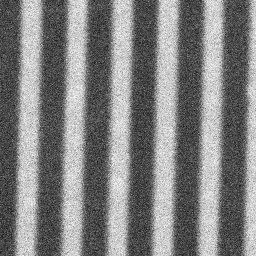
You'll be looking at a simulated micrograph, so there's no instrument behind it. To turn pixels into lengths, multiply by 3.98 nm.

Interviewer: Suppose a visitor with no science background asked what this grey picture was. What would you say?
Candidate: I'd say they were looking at parallel lines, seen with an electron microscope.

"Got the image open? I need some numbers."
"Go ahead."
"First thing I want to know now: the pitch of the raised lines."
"0.181 micrometres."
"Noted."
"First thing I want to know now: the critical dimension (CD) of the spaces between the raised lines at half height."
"0.0999 microns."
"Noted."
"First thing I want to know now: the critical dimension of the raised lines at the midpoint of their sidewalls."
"80.5 nm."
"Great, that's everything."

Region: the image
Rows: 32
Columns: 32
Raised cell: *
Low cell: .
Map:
...**...***...***...**....**...*
...**...***...***...**....**...*
...**...***...***...**....**...*
...**...***...***...**....**...*
...**...***...**....**....**...*
...**...***...**....**....**...*
...**...***...**....**...***...*
...**...***...**....**...***...*
...**...***...**....**...***...*
...**...***...**....**...***...*
...**...***...**....**...***...*
...**...***...**....**...***...*
...**...***...**....**...***...*
..***...***...**....**...***...*
..***...**....**...***...***...*
..***...**....**...***...***...*
..***...***...**...***...***...*
..***...**....**...***...***...*
..***...**....**...***...***...*
..***...**....**...***...***...*
..***...**....**...***...***...*
..***...**....**...***...***...*
..***...**....**...***...***...*
..***...**....**...***...**....*
..***...**....**...***...**....*
..***...**....**...***...**....*
..***...**....**...***...**....*
..***...**...***...***...**....*
..***...**...***...***...**....*
..***...**...***...***...**....*
..**....**...***...***...**....*
..**....**...***...***...**....*